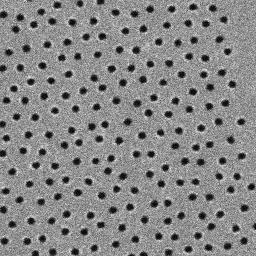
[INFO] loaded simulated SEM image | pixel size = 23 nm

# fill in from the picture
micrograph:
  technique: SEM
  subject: a regular array of holes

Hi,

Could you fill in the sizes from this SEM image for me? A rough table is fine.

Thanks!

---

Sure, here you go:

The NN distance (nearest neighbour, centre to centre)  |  376 nanometers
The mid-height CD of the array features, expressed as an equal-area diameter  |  190 nanometers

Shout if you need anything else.